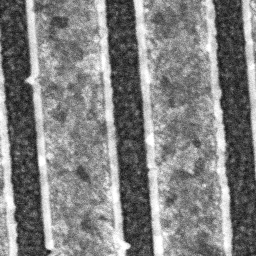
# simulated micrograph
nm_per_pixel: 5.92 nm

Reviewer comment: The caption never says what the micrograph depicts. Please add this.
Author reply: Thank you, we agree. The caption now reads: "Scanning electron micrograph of one or a few lines or trenches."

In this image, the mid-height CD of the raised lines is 420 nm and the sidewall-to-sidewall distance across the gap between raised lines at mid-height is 219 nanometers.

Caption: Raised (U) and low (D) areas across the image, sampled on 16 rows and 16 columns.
DDUUUUDDDUUUUDDU
DDUUUUDDDUUUUDDD
DDUUUUDDDUUUUDDD
DDUUUUUDDUUUUDDD
DDUUUUUDDUUUUDDD
DDUUUUUDDUUUUDDD
DDUUUUUDDUUUUUDD
DDUUUUUDDUUUUUDD
DDDUUUUDDUUUUUDD
DDDUUUUDDUUUUUDD
DDDUUUUDDDUUUUDD
DDDUUUUDDDUUUUDD
UDDUUUUDDDUUUUDD
UDDUUUUDDDUUUUDD
UDDUUUUDDDUUUUDD
UDDUUUUUDDUUUUDD